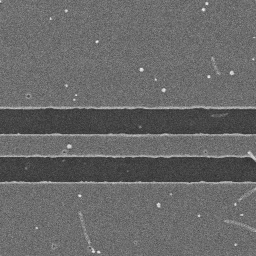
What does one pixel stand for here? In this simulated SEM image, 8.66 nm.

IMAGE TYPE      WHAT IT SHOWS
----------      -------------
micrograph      lines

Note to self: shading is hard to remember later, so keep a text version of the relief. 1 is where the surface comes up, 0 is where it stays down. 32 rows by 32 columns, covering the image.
11111111111111111111111111111111
11111111111111111111111111111111
11111111111111111111111111111111
11111111111111111111111111111111
11111111111111111111111111111111
11111111111111111111111111111111
11111111111111111111111111111111
11111111111111111111111111111111
11111111111111111111111111111111
11111111111111111111111111111111
11111111111111111111111111111111
11111111111111111111111111111111
11111111111111111111111111111111
11111111101111111011111101111111
00000000000000000000000000000000
00000000000000000000000000000000
00000000000000000000000000000000
11111111111111111111111111111111
11111111111111111111111111111111
11111111111111111111111111111111
00000000000000000000000000000000
00000000000000000000000000000000
00000000000000000000000000000000
11111111111111111111111111111111
11111111111111111111111111111111
11111111111111111111111111111111
11111111111111111111111111111111
11111111111111111111111111111111
11111111111111111111111111111111
11111111111111111111111111111111
11111111111111111111111111111111
11111111111111111111111111111111